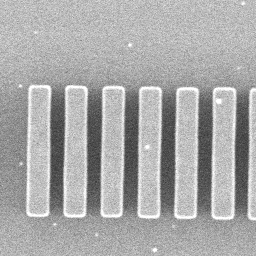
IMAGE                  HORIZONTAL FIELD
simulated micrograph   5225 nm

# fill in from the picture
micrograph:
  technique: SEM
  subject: groups of lines, slits or small figures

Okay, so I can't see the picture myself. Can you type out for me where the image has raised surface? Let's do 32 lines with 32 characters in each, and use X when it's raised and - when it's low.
--------------------------------
--------------------------------
--------------------------------
--------------------------------
--------------------------------
--------------------------------
--------------------------------
--------------------------------
--------------------------------
--------------------------------
--------------------------------
----XX--XXX--XXX--XX--XXX--XX--X
----XX--XXX--XXX--XX--XXX--XX--X
----XX--XXX--XX--XXX--XXX--XX--X
----XX--XXX--XX--XXX--XXX--XX--X
----XX--XXX--XX--XXX--XXX--XX--X
----XX--XXX--XX--XXX--XXX--XX--X
----XX--XXX--XX--XXX--XXX--XX--X
----XX--XXX--XX--XXX--XXX--XX--X
---XXX--XXX--XX--XXX--XXX--XX--X
---XXX--XXX--XX--XXX--XXX--XX--X
---XXX--XXX--XX--XXX--XXX--XX--X
---XXX--XXX--XX--XXX--XXX--XX--X
---XXX--XXX--XX--XXX--XXX--XX--X
---XXX--XXX--XX--XXX--XXX--XX--X
---XXX--XXX--XX--XXX--XXX--XX--X
---XXX--XXX--XX--XXX--XX---XX--X
--------------------------------
--------------------------------
--------------------------------
--------------------------------
--------------------------------